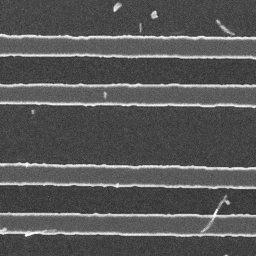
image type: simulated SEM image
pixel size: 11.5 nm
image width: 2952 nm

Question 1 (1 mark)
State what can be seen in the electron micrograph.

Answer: lines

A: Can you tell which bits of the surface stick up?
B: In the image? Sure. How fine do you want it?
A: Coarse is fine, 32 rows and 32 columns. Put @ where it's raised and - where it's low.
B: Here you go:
--------------------------------
--------------------------------
--------------------------------
--------------------------------
@@@@@---@------@@---------------
@@@@@@@@@@@@@@@@@@@@@@@@@@@@@@@@
@@@@@@@@@@@@@@@@@@@@@@@@@@@@@@@@
--------------------------------
--------------------------------
--------------------------------
--------------------------------
@@@@@@@@@@@@@@@@@@@@@@@@@@@@@@@@
@@@@@@@@@@@@@@@@@@@@@@@@@@@@@@@@
--------------------------------
--------------------------------
--------------------------------
--------------------------------
--------------------------------
--------------------------------
--------------------------------
--@@----------------------------
@@@@@@@@@@@@@@@@@@@@@@@@@@@@@@@@
@@@@@@@@@@@@@@@@@@@@@@@@@@@@@@@@
--------------------------@--@@@
--------------------------------
--------------------------------
--------------------------------
@@@@@@@@@@@@@@@@@@@@@@@@@@@@@@@@
@@@@@@@@@@@@@@@@@@@@@@@@@@@@@@@@
----------------------@@-@-@-@@@
--------------------------------
--------------------------------